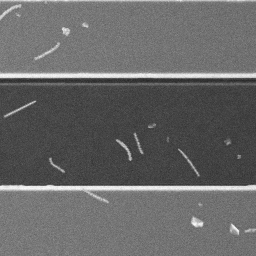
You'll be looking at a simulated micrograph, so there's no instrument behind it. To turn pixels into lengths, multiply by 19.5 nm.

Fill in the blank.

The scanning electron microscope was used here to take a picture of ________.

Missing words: lines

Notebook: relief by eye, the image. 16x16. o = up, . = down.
oooooooooooooooo
oooooooooooooooo
oooooooooooooooo
oooooooooooooooo
oooooooooooooooo
................
................
................
................
................
................
................
oooooooooooooooo
oooooooooooooooo
oooooooooooooooo
oooooooooooooooo